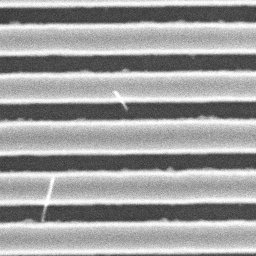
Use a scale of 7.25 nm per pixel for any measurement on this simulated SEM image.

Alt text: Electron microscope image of lines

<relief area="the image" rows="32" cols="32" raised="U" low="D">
UUUUUUUUUUUUUUUUUUUUUUUUUUUUUUDU
DDDDDDDDDDDDDDDDDDDDDDDDDDDDDDDD
DDDDDDDDDDDDDDDDDDDDDDDDDDDDDDDD
UUUUUUUUUUUUUUUUUUUUUUUUUUUUUUUU
UUUUUUUUUUUUUUUUUUUUUUUUUUUUUUUU
UUUUUUUUUUUUUUUUUUUUUUUUUUUUUUUU
UUUUUUUUUUUUUUUUUUUUUUUUUUUUUUUU
DDDDDDDDDDDDDDDDDDDDDDDDDDDDDDDD
DDDDDDDDDDDDDDDDDDDDDDDDDDDDDDDD
UUUUUUUUUUUUUUUUUUUUUUUUUUUUUUUU
UUUUUUUUUUUUUUUUUUUUUUUUUUUUUUUU
UUUUUUUUUUUUUUUUUUUUUUUUUUUUUUUU
UUUUUUUUUUUUUUUUUUUUUUUUUUUUUUUU
DDDDDDDDDDDDDDDDDDDDDDDDDDDDDDDD
DDDDDDDDDDDDDDDDDDDDDDDDDDDDDDDD
UUUUUUUUUUUUUUUUUUUUUUUUUUUUUUUU
UUUUUUUUUUUUUUUUUUUUUUUUUUUUUUUU
UUUUUUUUUUUUUUUUUUUUUUUUUUUUUUUU
UUUUUUUUUUUUUUUUUUUUUUUUUUUUUUUU
DDDDDDDDDDDDDDDDDDDDDDDDDDDDDDDD
DDDDDDDDDDDDDDDDDDDDDDDDDDDDDDDD
DDDDDDDDDDDDDDDDUUUUUDUUUUUUUUUU
UUUUUUUUUUUUUUUUUUUUUUUUUUUUUUUU
UUUUUUUUUUUUUUUUUUUUUUUUUUUUUUUU
UUUUUUUUUUUUUUUUUUUUUUUUUUUUUUUU
UDDDDUDDDDDDDDDDDDDDDDDDDDDDDDDD
DDDDDDDDDDDDDDDDDDDDDDDDDDDDDDDD
DDDDDDDDDDDDDDDDDDDDDDDDDDDDDDDD
UUUUUUUUUUUUUUUUUUUUUUUUUUUUUUUU
UUUUUUUUUUUUUUUUUUUUUUUUUUUUUUUU
UUUUUUUUUUUUUUUUUUUUUUUUUUUUUUUU
UUUUUUUUUUUUUUUUUUUUUUUUUUUUUUUU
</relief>